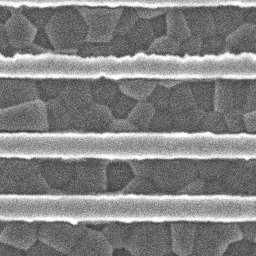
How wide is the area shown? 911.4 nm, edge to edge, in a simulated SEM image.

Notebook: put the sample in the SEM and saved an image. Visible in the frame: one or a few lines or trenches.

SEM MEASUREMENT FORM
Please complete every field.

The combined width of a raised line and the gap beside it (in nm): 252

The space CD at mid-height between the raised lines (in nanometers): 175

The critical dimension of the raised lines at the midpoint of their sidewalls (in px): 24.6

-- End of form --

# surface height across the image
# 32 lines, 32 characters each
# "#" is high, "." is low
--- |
################################
................................
................................
................................
................................
................................
................................
################################
################################
################################
................................
................................
................................
.###............................
#####...........................
#####...........................
####............................
################################
################################
################################
................................
................................
................................
................................
###########.#########.##..###...
################################
################################
...#############################
................................
................................
................................
................................